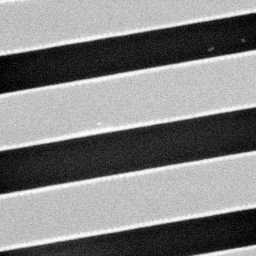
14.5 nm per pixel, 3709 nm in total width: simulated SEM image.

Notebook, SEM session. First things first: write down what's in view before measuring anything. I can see lines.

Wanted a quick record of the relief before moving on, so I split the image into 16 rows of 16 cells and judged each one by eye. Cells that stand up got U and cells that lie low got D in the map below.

UUUUUUUUUUUUUUUU
UUUUUUUUUUUUDDDD
UUUUUUDDDDDDDDDD
DDDDDDDDDDDDDDUU
DDDDDDDDUUUUUUUU
DDUUUUUUUUUUUUUU
UUUUUUUUUUUUUUUU
UUUUUUUUUUUDDDDD
UUUUUDDDDDDDDDDD
DDDDDDDDDDDDDDDD
DDDDDDDDDDUUUUUU
DDDDUUUUUUUUUUUU
UUUUUUUUUUUUUUUU
UUUUUUUUUUUUUDDD
UUUUUUUDDDDDDDDD
UDDDDDDDDDDDDDDU